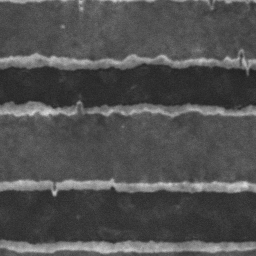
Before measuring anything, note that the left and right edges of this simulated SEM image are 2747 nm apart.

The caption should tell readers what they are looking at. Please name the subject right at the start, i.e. one or a few lines or trenches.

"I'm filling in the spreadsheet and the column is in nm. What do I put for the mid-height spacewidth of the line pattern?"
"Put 569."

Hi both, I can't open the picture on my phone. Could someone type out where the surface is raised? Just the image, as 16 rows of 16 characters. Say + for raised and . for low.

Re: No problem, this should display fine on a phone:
++++++++++++++++
++++++++++++++++
++++++++++++++++
++++++++++++++++
................
................
................
++++++++++++++++
++++++++++++++++
++++++++++++++++
++++++++++++++++
++++++++++++++++
................
................
................
++++++++++++++++